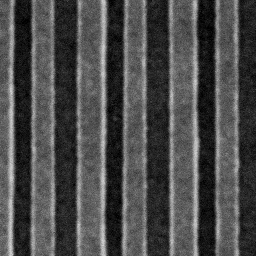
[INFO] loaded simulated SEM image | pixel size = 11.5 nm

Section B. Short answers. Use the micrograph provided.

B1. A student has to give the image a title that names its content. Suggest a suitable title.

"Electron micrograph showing lines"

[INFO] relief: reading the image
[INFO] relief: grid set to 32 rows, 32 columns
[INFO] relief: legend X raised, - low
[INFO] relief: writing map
X---XXX---XXX---XX---XXX---XXX--
X---XXX---XXX---XX---XXX---XXX--
X---XXX---XXX---XX---XXX---XXX--
X---XXX---XXX---XX---XXX---XXX--
X---XXX---XXX---XX---XXX---XXX--
X---XXX---XXX---XX---XXX---XXX--
X---XXX---XXX---XX---XXX---XXX--
X---XXX---XXX---XX---XXX---XXX--
X---XXX---XXX---XX---XXX---XXX--
X---XXX---XXX---XX---XXX---XXX--
X---XXX---XXX---XX---XXX---XXX--
X---XXX---XXX---XX---XXX---XXX--
X---XXX---XXX---XX---XXX---XXX--
X---XXX---XXX---XX---XXX---XXX--
X---XXX---XXX---XX---XXX---XXX--
X---XXX---XXX---XX---XXX---XXX--
X---XXX---XXX---XX---XXX---XXX--
X---XXX---XXX---XX---XXX---XXX--
X---XXX---XXX---XX---XXX---XXX--
X---XXX---XXX---XX---XXX---XXX--
X---XXX---XXX--XXX---XXX---XXX--
X---XXX---XXX--XXX---XXX---XXX--
X---XXX---XXX--XXX---XXX---XXX--
X---XXX---XXX--XXX---XXX---XXX--
X---XXX---XXX--XXX---XXX---XXX--
X---XXX---XXX--XXX---XXX---XXX--
X---XXX---XXX--XXX---XXX---XXX--
X---XXX---XXX--XXX---XXX---XXX--
X---XXX---XXX--XXX---XXX---XXX--
X---XXX---XXX--XXX---XXX---XXX--
X---XXX---XXX--XXX---XXX---XXX--
X---XXX---XXX--XXX---XXX---XXX--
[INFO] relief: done